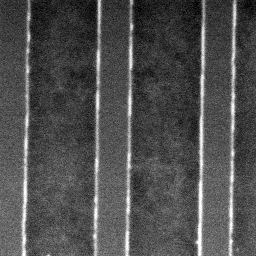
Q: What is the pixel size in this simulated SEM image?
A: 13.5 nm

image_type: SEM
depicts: lines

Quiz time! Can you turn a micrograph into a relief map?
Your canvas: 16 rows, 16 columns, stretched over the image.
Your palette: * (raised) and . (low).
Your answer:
**....**.....**.
**....**.....**.
**....**.....**.
**....**.....**.
**....**.....**.
**....**.....**.
**....**.....**.
**....**.....**.
**....**.....**.
**....**.....**.
**....**.....**.
**....**.....**.
**....**.....*..
**....**.....*..
**....**....**..
**....**....**..